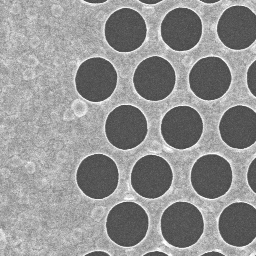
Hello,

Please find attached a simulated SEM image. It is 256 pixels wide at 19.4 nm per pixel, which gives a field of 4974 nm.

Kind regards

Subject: a regular array of holes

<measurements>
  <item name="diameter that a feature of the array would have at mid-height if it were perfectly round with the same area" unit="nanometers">849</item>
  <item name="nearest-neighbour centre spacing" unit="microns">1.08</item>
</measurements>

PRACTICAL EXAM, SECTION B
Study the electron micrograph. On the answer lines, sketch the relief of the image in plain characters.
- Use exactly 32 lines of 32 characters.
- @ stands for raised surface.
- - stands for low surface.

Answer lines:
@@@@@@@@@@@@@@@@@@-@@@@@@@@@@@@@
@@@@@@@@@@@@@@---@@@@---@@@@----
@@@@@@@@@@@@@-----@@-----@@-----
@@@@@@@@@@@@@-----@@-----@@-----
@@@@@@@@@@@@@-----@@-----@@-----
@@@@@@@@@@@@@@----@@@----@@@----
@@@@@@@@@@@@@@@-@@@@@@@@@@@@@@@@
@@@@@@@@@@@--@@@@@---@@@@---@@@@
@@@@@@@@@@----@@@-----@@-----@@-
@@@@@@@@@------@@-----@@-----@@-
@@@@@@@@@------@@-----@@-----@@-
@@@@@@@@@@----@@@----@@@----@@@-
@@@@@@@@@@@--@@@@@--@@@@@@-@@@@@
@@@@@@@@@@@@@@---@@@@@--@@@@@--@
@@@@@@@@@@@@@-----@@@----@@@----
@@@@@@@@@@@@@-----@@-----@@-----
@@@@@@@@@@@@@-----@@-----@@-----
@@@@@@@@@@@@@@----@@@----@@@----
@@@@@@@@@@@@@@@--@@@@@-@@@@@@--@
@@@@@@@@@@@--@@@@@--@@@@@---@@@@
@@@@@@@@@@----@@@----@@@-----@@-
@@@@@@@@@@-----@------@@-----@@-
@@@@@@@@@@-----@------@@-----@@-
@@@@@@@@@@-----@@----@@@-----@@-
@@@@@@@@@@@---@@@@--@@@@@---@@@@
@@@@@@@@@@@@@@@--@@@@@--@@@@@--@
@@@@@@@@@@@@@@----@@-----@@@----
@@@@@@@@@@@@@------@-----@@-----
@@@@@@@@@@@@@------@-----@@-----
@@@@@@@@@@@@@@----@@-----@@@----
@@@@@@@@@@@@@@@--@@@@---@@@@@--@
@@@@@@@@@@@@-@@@@@@-@@@@@@-@@@@@